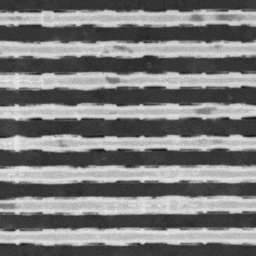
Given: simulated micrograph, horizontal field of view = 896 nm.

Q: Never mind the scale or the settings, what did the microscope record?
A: wiring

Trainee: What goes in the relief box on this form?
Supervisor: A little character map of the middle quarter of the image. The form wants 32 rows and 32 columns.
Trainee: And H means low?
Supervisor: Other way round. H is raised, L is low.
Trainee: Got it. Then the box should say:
LLLLLLLLLLLLLLLLLLLLLLLLLLLLLLLL
LLLLLLLLLLLLLLLLLLLLLLLLLLLLLLLL
LLLLLLLLLLLLLLLLLLLLLLLLLLLLLLLL
HHHHHHHHHHHHHHHHHHHHHHHHHHHHHHHH
HHHHHHHHHHHHHHHHHHHHHHHHHHHHHHHH
HHHHHHHHHLHHHLLLLLLHLLLLLHHHHLLL
LLLLLLLLLLLLLLLLLLLLLLLLLLLLLLLL
LLLLLLLLLLLLLLLLLLLLLLLLLLLLLLLL
LLLLLLLLLLLLLLLLLLLLLLLLLLLLLLLL
LLLLLLLLLLLLLLLLLLLLLLLLLLLLLLLL
LLLLHLLLLLLLLLLLLLLLLLLLLHHHLLLL
HHHHHHHHHHHHHHHHHHHHHHHHHHHHHHHH
HHHHHHHHHHHHHHHHHHHHHHHHHHHHHHHH
LLLLLLLLLLLLLLLLLLLLLLLLLLLLLLLL
LLLLLLLLLLLLLLLLLLLLLLLLLLLLLLLL
LLLLLLLLLLLLLLLLLLLLLLLLLLLLLLLL
LLLLLLLLLLLLLLLLLLLLLLLLLLLLLLLL
LLLLLLLLLLLLLLLLLLLLLLLLLLLLLLLL
HHLHLLLLLLLLLLLLLLLLLLLLLHHHHLLL
HHHHHHHHHHHHHHHHHHHHHHHHHHHHHHHH
HHHHHHHHHHHHHHHHHHHHHHHHHHHHHHHH
LLLLLLLLLLLLLLLLLLLLLLLLLLLLLLLL
LLLLLLLLLLLLLLLLLLLLLLLLLLLLLLLL
LLLLLLLLLLLLLLLLLLLLLLLLLLLLLLLL
LLLLLLLLLLLLLLLLLLLLLLLLLLLLLLLL
LLLLLLLLLLLLLLLLLLLLLLLLLLLLLLLL
HHHHHHHHHHHHHHHHHHHHHHHHHHHHHHHH
HHHHHHHHHHHHHHHHHHHHHHHHHHHHHHHH
HHHHHHHHHHHHHHHHHHHHHHHHHHHHHHHH
LLLLLLLLLLLLLLLLLLLLLLLLLLLLLLLL
LLLLLLLLLLLLLLLLLLLLLLLLLLLLLLLL
LLLLLLLLLLLLLLLLLLLLLLLLLLLLLLLL